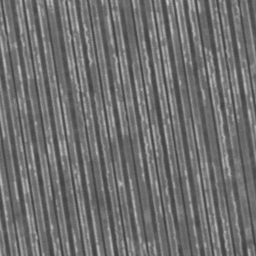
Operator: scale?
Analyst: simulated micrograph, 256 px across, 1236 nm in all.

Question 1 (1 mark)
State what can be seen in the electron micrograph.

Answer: parallel lines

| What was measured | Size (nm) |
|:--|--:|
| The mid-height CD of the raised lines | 33.5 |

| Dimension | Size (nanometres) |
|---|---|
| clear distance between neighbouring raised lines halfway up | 23.8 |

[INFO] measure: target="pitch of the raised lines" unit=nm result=51.4